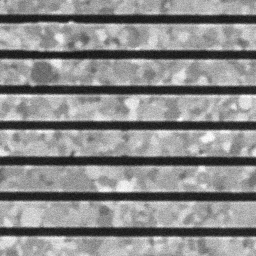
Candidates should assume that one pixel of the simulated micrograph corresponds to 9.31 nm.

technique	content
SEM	parallel lines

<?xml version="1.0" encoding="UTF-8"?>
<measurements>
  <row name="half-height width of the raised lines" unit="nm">236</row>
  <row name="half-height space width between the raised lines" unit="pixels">10.1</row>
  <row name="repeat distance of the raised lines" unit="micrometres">0.331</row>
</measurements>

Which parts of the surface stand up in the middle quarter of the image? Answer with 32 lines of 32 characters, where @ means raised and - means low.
@@@@@@@@@@@@@@@@@@@@@@@@@@@@@@@@
@@@@@@@@@@@@@@@@@@@@@@@@@@@@@@@@
@@@@@@@@@@@@@@@@@@@@@@@@@@@@@@@@
@@@@@@@@@@@@@@@@@@@@@@@@@@@@@@@@
@@@@@@@@@@@@@@@@@@@@@@@@@@@@@@@@
--------------------------------
--------------------------------
--------------------------------
@@@@@@@@@@@@@@@@@@@@@@@@@@@@@@@@
@@@@@@@@@@@@@@@@@@@@@@@@@@@@@@@@
@@@@@@@@@@@@@@@@@@@@@@@@@@@@@@@@
@@@@@@@@@@@@@@@@@@@@@@@@@@@@@@@@
@@@@@@@@@@@@@@@@@@@@@@@@@@@@@@@@
@@@@@@@@@@@@@@@@@@@@@@@@@@@@@@@@
--------------------------------
--------------------------------
--------------------------------
@@@@@@@@@@@@@@@@@@@@@@@@@@@@@@@@
@@@@@@@@@@@@@@@@@@@@@@@@@@@@@@@@
@@@@@@@@@@@@@@@@@@@@@@@@@@@@@@@@
@@@@@@@@@@@@@@@@@@@@@@@@@@@@@@@@
@@@@@@@@@@@@@@@@@@@@@@@@@@@@@@@@
@@@@@@@@@@@@@@@@@@@@@@@@@@@@@@@@
--------------------------------
--------------------------------
--------------------------------
@@@@@@@@@@@@@@@@@@@@@@@@@@@@@@@@
@@@@@@@@@@@@@@@@@@@@@@@@@@@@@@@@
@@@@@@@@@@@@@@@@@@@@@@@@@@@@@@@@
@@@@@@@@@@@@@@@@@@@@@@@@@@@@@@@@
@@@@@@@@@@@@@@@@@@@@@@@@@@@@@@@@
@@@@@@@@@@@@@@@@@@@@@@@@@@@@@@@@